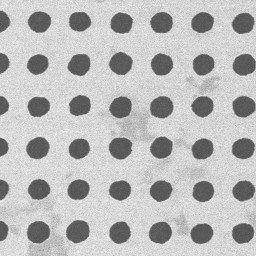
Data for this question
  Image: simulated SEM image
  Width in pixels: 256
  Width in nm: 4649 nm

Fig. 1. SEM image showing a regular array of holes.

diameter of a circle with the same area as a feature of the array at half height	397	nm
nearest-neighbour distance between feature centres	740	nm